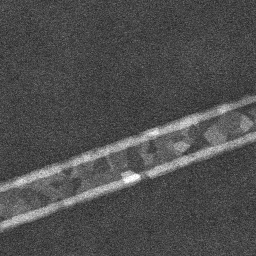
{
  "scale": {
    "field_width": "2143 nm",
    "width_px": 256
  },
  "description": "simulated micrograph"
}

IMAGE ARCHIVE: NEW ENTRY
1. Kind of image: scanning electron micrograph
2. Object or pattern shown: one or a few lines or trenches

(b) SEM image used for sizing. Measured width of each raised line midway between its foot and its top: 284 nm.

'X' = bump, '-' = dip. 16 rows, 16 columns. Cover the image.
----------------
----------------
----------------
----------------
----------------
----------------
---------------X
------------XXXX
---------XXXXXXX
-------XXXXXX---
----XXXXXX------
-XXXXXX---------
XXXXX-----------
XX--------------
----------------
----------------